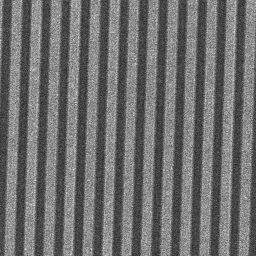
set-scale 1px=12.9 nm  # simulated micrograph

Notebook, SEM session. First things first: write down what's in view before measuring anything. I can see parallel lines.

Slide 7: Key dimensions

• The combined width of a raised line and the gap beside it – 252 nm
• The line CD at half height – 129 nm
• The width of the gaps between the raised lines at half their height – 0.116 micrometres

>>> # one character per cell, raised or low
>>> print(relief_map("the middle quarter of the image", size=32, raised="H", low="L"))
LHHHLLHHLLLHHLLLHHLLLHHLLLHHLLHH
LHHHLLHHLLLHHLLLHHLLLHHLLHHHLLHH
LHHHLLHHLLLHHLLLHHLLLHHLLLHHLLHH
LHHHLLHHLLLHHLLLHHLLLHHLLLHHLLHH
LHHHLLHHLLLHHLLLHHLLLHHLLLHHLLHH
LHHHLLHHLLLHHLLLHHLLLHHLLLHHLLHH
LHHHLLHHLLLHHLLLHHLLLHHLLLHHLLHH
LHHLLLHHLLLHHLLLHHLLHHHLLHHHLLHH
LHHLLLHHLLLHHLLLHHLLHHHLLHHHLLHH
LHHLLLHHLLLHHLLLHHLLHHHLLHHHLLHH
LHHLLLHHLLLHHLLLHHLLHHHLLHHHLLHH
LHHLLLHHLLLHHLLLHHLLHHHLLHHHLLHH
LHHLLLHHLLLHHLLLHHLLHHHLLHHHLLHH
LHHLLLHHLLLHHLLLHHLLHHHLLHHHLLHH
LHHLLLHHLLLHHLLLHHLLHHHLLHHHLLHH
LHHLLLHHLLHHHLLHHHLLHHHLLHHHLLHH
LHHLLLHHLLHHHLLHHHLLHHHLLHHLLLHH
LHHLLLHHLLHHHLLHHHLLHHLLLHHLLLHH
LHHLLLHHLLHHHLLHHHLLHHLLLHHLLLHH
LHHLLLHHLLHHHLLHHHLLHHLLLHHLLLHH
LHHLLLHHLLHHHLLHHHLLHHHLLHHLLLHH
LHHLLLHHLLHHHLLHHHLLHHHLLHHLLLHH
LHHLLLHHLLHHHLLHHHLLHHLLLHHLLLHH
HHHLLHHHLLHHHLLHHHLLHHLLLHHLLLHH
HHHLLHHHLLHHHLLHHLLLHHLLLHHLLLHH
HHHLLHHHLLHHHLLHHLLLHHLLLHHLLLHH
HHHLLHHHLLHHHLLHHLLLHHLLLHHLLLHH
HHHLLHHHLLHHHLLHHLLLHHLLLHHLLLHH
HHHLLHHHLLHHHLLHHLLLHHLLLHHLLLHH
HHHLLHHHLLHHHLLHHLLLHHLLLHHLLLHH
HHHLLHHHLLHHHLLHHLLLHHLLLHHLLLHH
HHHLLHHHLLHHHLLHHLLLHHLLHHHLLHHH